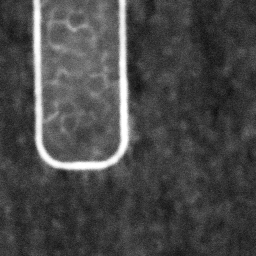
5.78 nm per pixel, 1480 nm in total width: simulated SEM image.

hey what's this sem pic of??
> one or a few lines or trenches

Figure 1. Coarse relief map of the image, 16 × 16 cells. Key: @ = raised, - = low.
@@------@@@@@@@@
@@------@@@@@@@@
@@------@@@@@@@@
@@------@@@@@@@@
@@------@@@@@@@@
@@------@@@@@@@@
@@------@@@@@@@@
@@------@@@@@@@@
@@------@@@@@@@@
@@@----@@@@@@@@@
@@@@@@@@@@@@@@@@
@@@@@@@@@@@@@@@@
@@@@@@@@@@@@@@@@
@@@@@@@@@@@@@@@@
@@@@@@@@@@@@@@@@
@@@@@@@@@@@@@@@@